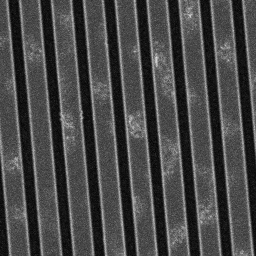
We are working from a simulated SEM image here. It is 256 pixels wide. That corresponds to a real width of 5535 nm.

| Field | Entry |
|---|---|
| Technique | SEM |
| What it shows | parallel lines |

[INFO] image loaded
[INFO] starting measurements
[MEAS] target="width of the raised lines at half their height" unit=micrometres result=0.458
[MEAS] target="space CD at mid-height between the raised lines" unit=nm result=232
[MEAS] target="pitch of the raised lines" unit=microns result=0.687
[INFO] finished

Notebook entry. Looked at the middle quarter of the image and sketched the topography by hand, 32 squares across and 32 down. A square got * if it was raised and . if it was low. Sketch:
***...*****...*****...*****...**
***...*****...*****...*****...**
****..*****...*****...*****...**
****...****....****....****....*
****...*****...*****...*****...*
****...*****...*****...*****...*
****...*****...*****...*****...*
****...*****...*****...*****...*
****...*****...*****...*****...*
****...*****...*****...*****...*
****...*****...*****...*****...*
****...*****...*****...*****...*
****...*****...*****...*****...*
*****..*****...*****...*****...*
****...*****...*****...*****...*
*****...****....****....****....
*****...*****...*****...*****...
*****...*****...*****...*****...
*****...*****...*****...*****...
*****...*****...*****...*****...
*****...*****...*****...*****...
*****...*****...*****...*****...
*****...*****...*****...*****...
*****...*****...*****...*****...
*****...*****...*****...*****...
******..*****...*****...*****...
.*****...****....****....****...
.*****...*****...*****...*****..
.*****...*****...*****...*****..
.*****...*****...*****...*****..
.*****...*****...*****...*****..
.*****...*****...*****...*****..